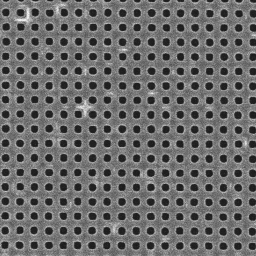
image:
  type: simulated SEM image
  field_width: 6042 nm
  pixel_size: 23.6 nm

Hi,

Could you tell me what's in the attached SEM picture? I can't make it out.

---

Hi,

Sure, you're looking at a regular array of holes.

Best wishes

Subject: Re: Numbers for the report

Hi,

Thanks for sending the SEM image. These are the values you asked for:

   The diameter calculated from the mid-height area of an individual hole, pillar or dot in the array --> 194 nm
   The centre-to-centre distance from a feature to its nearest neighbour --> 334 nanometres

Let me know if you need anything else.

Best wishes